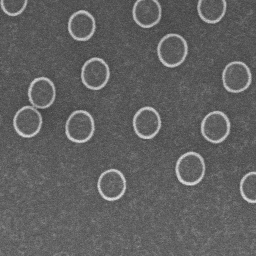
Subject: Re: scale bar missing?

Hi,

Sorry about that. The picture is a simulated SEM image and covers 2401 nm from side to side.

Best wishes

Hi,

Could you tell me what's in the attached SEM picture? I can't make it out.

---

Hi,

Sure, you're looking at a regular array of raised bodies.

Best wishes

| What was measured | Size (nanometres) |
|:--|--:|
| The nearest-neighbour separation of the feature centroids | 467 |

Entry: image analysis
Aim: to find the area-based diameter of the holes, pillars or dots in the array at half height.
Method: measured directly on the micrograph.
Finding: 28.4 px